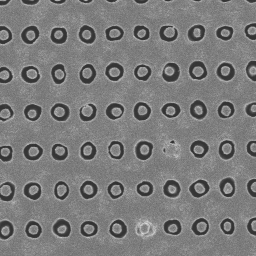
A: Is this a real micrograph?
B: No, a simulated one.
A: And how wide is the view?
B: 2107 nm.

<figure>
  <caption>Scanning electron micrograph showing a regular array of ring-shaped grooves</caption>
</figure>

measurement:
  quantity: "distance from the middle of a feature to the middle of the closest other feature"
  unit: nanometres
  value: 222